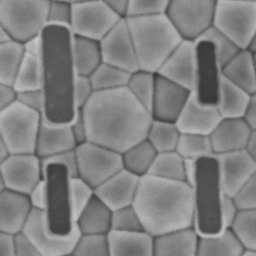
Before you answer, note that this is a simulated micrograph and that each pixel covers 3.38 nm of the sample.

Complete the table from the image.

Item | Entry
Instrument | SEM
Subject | holes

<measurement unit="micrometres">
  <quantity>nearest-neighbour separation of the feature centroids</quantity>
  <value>0.42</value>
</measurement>